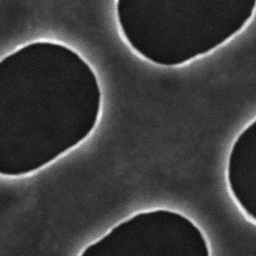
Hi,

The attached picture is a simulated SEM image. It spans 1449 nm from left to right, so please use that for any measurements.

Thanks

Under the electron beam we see holes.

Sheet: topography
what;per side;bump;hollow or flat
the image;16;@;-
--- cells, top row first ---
@@@@@@@---------
@@@@@@@--------@
@@@@@@@@------@@
@----@@@@---@@@@
------@@@@@@@@@@
------@@@@@@@@@@
------@@@@@@@@@@
------@@@@@@@@@@
-----@@@@@@@@@@-
----@@@@@@@@@@--
--@@@@@@@@@@@@--
@@@@@@@@@@@@@@--
@@@@@@@@@@@@@@@-
@@@@@@@@@--@@@@@
@@@@@@@-----@@@@
@@@@@@-------@@@